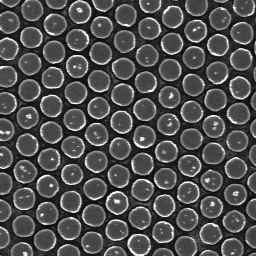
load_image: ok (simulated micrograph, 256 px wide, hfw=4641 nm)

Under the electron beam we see a regular array of raised bodies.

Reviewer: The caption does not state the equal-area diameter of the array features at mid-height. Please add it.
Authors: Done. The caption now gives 404 nm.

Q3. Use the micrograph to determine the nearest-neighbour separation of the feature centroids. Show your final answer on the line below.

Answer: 478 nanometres